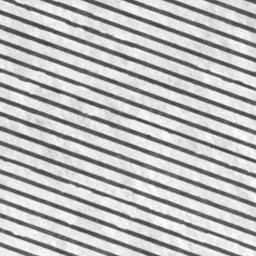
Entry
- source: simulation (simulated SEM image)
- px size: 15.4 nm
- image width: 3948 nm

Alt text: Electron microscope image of parallel lines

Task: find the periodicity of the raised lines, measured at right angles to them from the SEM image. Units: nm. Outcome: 210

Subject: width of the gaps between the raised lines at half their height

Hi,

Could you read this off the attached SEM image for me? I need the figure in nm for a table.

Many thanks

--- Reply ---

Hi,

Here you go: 79.9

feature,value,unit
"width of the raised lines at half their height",7.77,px